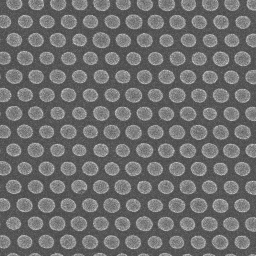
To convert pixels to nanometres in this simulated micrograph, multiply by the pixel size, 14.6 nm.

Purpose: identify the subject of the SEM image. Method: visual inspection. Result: a regular array of raised bodies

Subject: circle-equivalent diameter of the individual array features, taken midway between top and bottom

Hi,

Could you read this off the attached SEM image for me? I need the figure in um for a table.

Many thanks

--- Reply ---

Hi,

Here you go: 0.21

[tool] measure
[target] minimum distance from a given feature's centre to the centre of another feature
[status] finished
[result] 308 nm